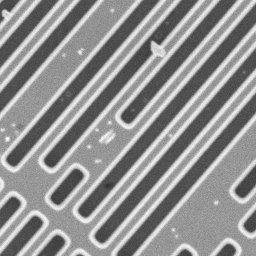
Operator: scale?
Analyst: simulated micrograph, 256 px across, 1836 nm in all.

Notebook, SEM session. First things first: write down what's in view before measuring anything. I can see groups of lines, slits or small figures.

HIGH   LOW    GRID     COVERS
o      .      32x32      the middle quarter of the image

ooooo.....oooo......oooo......oo
oooo.....ooooo.....oooo......ooo
ooo......oooo.....oooo......oooo
oo......oooo.....oooo......oooo.
o......oooo......oooo.....oooo..
......oooo......oooo.....ooooo..
.....oooo......oooo.....oooo....
....oooo......oooo......oooo....
...ooooo.....oooo......oooo.....
...ooo......oooo......oooo......
..oooo.....oooo......oooo......o
.oooo......oooo.....oooo......oo
oooo......oooo.....oooo......ooo
ooo......ooooo....oooo......oooo
oo......oooooo....oooo.....oooo.
o......oooooooooooooo.....oooo..
......oooooooooooooo......oooo..
.....oooooooooooooo......oooo...
....oooooooooooooo......oooo....
....ooooooooooooo......oooo.....
...oooooooooooooo.....oooo......
..ooooooooooooo......oooo......o
.oooooooooooooo.....oooo......oo
oooooooooooooo......oooo.....ooo
ooooooooooooo.....ooooo.....oooo
oooooooooooo......oooo.....oooo.
oo...oooooo......oooo......oooo.
o.....oooo......oooo......oooo..
.....oooo......oooo......oooo...
.....oooo.....oooo......oooo....
....oooo.....ooooo.....oooo.....
...oooo.....ooooo.....oooo......